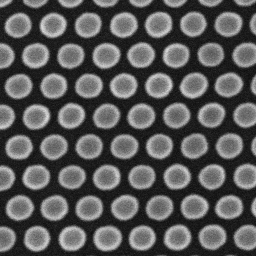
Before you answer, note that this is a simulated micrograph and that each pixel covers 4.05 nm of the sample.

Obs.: a regular array of raised bodies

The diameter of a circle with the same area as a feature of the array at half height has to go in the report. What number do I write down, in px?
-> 23.8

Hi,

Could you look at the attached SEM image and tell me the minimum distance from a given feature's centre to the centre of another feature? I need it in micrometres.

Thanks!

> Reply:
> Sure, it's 0.14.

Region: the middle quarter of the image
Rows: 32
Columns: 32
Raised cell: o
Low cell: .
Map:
ooo......ooo......oo.......oo...
................................
................................
....oooo.....oooo.....oooo....oo
...oooooo...oooooo...oooooo...oo
...oooooo...oooooo...oooooo..ooo
...oooooo...oooooo...ooooo...ooo
....oooo.....oooo....ooooo....oo
................................
................................
.oo.......oo......oo.......ooo..
ooooo...ooooo....ooooo....ooooo.
ooooo...oooooo..oooooo...oooooo.
ooooo...oooooo..oooooo...oooooo.
oooo....ooooo...oooooo....oooo..
ooo......ooo.....oooo......oo...
................................
................................
.....ooo.....oooo.....oooo.....o
....ooooo...oooooo...oooooo...oo
o..oooooo...oooooo...oooooo...oo
...oooooo...oooooo...oooooo...oo
....ooooo....oooo.....oooo....oo
................................
................................
............................o...
oooo....ooooo....ooooo....ooooo.
ooooo...oooooo...ooooo...oooooo.
ooooo...oooooo...ooooo...oooooo.
ooooo...oooooo...ooooo....ooooo.
oooo....ooooo....oooo.....oooo..
................................